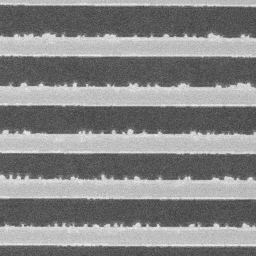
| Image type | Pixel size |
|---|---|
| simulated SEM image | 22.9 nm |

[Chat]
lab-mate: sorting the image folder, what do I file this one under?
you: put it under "lines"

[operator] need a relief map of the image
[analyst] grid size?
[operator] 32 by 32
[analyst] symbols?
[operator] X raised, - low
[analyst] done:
XXXXXXXXXXXXXXXXXXXXXXXXXXXXXXXX
--------------------------------
--------------------------------
--------------------------------
---X-XX------X------------X-----
XXXXXXXXXXXXXXXXXXXXXXXXXXXXXXXX
XXXXXXXXXXXXXXXXXXXXXXXXXXXXXXXX
--------------------------------
--------------------------------
--------------------------------
------------------------------X-
XXXXXXXXXXXXXXXXXXXXXXXXXXXXXXXX
XXXXXXXXXXXXXXXXXXXXXXXXXXXXXXXX
--------------------------------
--------------------------------
--------------------------------
----------------X---------------
XXXXXXXXXXXXXXXXXXXXXXXXXXXXXXXX
XXXXXXXXXXXXXXXXXXXXXXXXXXXXXXXX
--------------------------------
--------------------------------
--------------------------------
XXXXXX-XXX--X---XX-----X----X--X
XXXXXXXXXXXXXXXXXXXXXXXXXXXXXXXX
XXXXXXXXXXXXXXXXXXXXXXXXXXXXXXXX
--------------------------------
--------------------------------
--------------------------------
XXXXXXXXXXXXXXXXXXXXX--XX-XXXXXX
XXXXXXXXXXXXXXXXXXXXXXXXXXXXXXXX
XXXXXXXXXXXXXXXXXXXXXXXXXXXXXXXX
--------------------------------